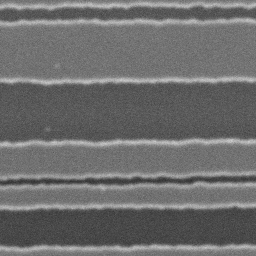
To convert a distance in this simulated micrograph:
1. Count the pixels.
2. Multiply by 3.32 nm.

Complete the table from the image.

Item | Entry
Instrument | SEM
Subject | lines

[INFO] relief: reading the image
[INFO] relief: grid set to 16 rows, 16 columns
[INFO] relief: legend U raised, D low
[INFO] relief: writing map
UUUUUUUUUUUUUUUU
UUUUUUUUUUUUUUUU
UUUUUUUUUUUUUUUU
UUUUUUUUUUUUUUUU
UUUUUUUUUUUUUUUU
DDDDDDDDDDDDDDDD
DDDDDDDDDDDDDDDD
DDDDDDDDDDDDDDDD
DDDDDDDDDDDDDDDD
UUUUUUUUUUUUUUUU
UUUUUUUUUUUUUUUU
UUUUUUUUUUUUUUUU
UUUUUUUUUUUUUUUU
DDDDDDDDDDDDDDDD
DDDDDDDDDDDDDDDD
UDUUUUUUUUUUUUUU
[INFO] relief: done